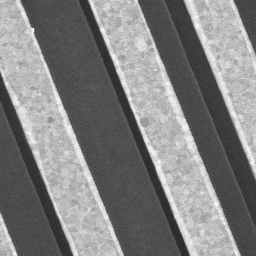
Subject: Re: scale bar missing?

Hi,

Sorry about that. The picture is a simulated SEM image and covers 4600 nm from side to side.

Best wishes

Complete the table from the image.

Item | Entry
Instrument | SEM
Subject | lines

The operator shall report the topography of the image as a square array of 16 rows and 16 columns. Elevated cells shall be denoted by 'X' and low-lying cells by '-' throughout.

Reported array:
X-----XXX---XXX-
XX----XXX---XXX-
XX-----XXX---XXX
XXX----XXX---XXX
XXX----XXX---XXX
XXX-----XXX---XX
-XXX----XXX---XX
-XXX-----XXX---X
--XXX----XXX---X
--XXX----XXX---X
--XXX-----XXX---
---XXX----XXX---
---XXX-----XXX--
----XXX----XXX--
----XXX----XXX--
X---XXXX----XXX-